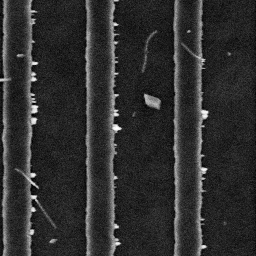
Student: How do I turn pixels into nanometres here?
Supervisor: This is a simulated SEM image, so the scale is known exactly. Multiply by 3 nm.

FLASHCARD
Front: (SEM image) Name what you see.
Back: lines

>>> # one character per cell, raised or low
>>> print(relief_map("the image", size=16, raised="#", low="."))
##...##....##...
##...##....##...
##...##....##...
##...##....##...
##...##....##...
##...##....##...
##...##....##...
##...##....##...
##...##....##...
##...##....##...
##...##....##...
##...##....##...
##...##....##...
##...##....##...
##...##....##...
##...##....##...